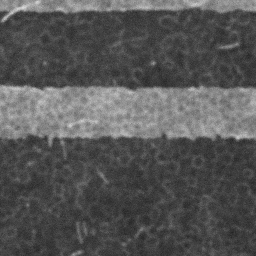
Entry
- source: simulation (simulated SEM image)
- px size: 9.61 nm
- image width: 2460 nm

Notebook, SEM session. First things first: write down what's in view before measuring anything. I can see one or a few lines or trenches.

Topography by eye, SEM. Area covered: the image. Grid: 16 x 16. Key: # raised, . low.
######.#########
................
................
................
................
#....##.........
################
################
#..#####.#.#####
................
................
................
................
................
................
................